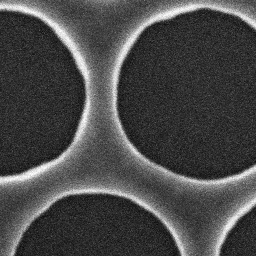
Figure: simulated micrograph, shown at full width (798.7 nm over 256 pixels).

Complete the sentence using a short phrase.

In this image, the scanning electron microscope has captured holes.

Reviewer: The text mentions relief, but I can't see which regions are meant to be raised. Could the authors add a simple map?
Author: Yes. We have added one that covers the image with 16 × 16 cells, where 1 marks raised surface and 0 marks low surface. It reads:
0111111111110111
0001111110000000
0000111100000000
0000011100000000
0000011000000000
0000011000000000
0000011000000000
0000011000000000
0000011100000000
0000111110000000
0011111111000000
1111111111111111
1111000011111111
1100000000111110
1100000000011100
1000000000011100